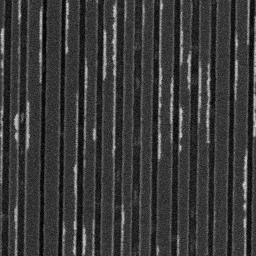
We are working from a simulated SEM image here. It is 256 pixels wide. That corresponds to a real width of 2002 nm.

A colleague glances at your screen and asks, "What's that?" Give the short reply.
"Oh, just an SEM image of parallel lines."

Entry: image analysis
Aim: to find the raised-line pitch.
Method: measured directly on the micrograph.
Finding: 148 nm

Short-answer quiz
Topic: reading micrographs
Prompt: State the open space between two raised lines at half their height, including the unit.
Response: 46.9 nm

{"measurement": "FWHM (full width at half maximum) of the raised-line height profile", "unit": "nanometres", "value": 102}